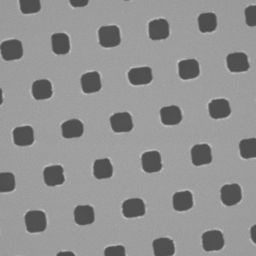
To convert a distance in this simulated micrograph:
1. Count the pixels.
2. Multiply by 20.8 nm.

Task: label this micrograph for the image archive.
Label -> a regular array of holes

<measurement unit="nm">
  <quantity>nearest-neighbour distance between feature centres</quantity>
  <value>1020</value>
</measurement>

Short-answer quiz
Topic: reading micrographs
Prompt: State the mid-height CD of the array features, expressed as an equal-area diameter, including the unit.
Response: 458 nm